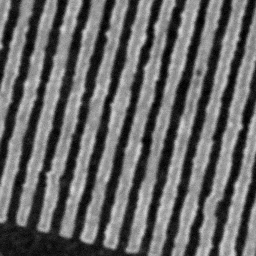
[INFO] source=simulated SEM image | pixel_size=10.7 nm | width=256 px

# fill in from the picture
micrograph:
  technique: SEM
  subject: parallel lines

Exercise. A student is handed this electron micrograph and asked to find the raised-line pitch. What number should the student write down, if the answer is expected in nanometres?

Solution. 245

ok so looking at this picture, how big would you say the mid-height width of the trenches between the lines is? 117 nm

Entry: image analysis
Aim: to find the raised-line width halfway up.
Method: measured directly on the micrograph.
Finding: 128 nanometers